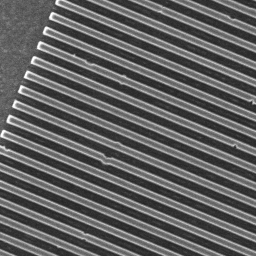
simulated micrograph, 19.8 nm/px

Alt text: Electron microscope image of parallel lines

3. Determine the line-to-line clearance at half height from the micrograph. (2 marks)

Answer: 176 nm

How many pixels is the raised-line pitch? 15.9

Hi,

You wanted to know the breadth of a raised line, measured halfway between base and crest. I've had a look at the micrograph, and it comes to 0.137 um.